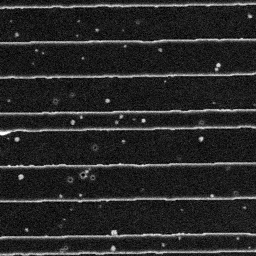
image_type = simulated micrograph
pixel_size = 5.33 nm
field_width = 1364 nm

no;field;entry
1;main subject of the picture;lines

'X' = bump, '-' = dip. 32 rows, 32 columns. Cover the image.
XXXXXXXXXXXXXXXXXXXXXXXXXXXXXXXX
--------------------------------
--------------------------------
--------------------------------
--------------------------------
XXXXXXXXXXXXXXXXXXXXXXXXXXXXXXXX
XXXXXXXXXXXXXXXXXXXXXXXXXXXXXXXX
XXXXXXXXXXXXXXXXXXXXXXXXXXXXXXXX
XXXXXXXXXXXXXXXXXXXXXXXXXXXXXXXX
XXXXXXXXXXXXXXXXXXXXXX----------
--------------------------------
--------------------------------
--------------------------------
--------------------------------
XXXXXXXXXXXXXXXXXXXXXXXXXXXXXXXX
XXXXXXXXXXXXXXXXXXXXXXXXXXXXXXXX
XX------------------------------
--------------------------------
--------------------------------
--------------------------------
--------------XX-----XXXXXXXXXXX
XXXXXXXXXXXXXXXXXXXXXXXXXXXXXXXX
XXXXXXXXXXXXXXXXXXXXXXXXXXXXXXXX
XXXXXXXXXXXXXXXXXXXXXXXXXXXXXXXX
XXXXXXXXXXXXXXXXXXXXXXXXXXXXXXXX
--------------------------------
--------------------------------
--------------------------------
--------------------------------
-------------XXXXXXXXXXXXXXXXXXX
XXXXXXXXXXXXXXXXXXXXXXXXXXXXXXXX
XXXXXXXXXXXXXXXXXXXXXXXXXXXX----